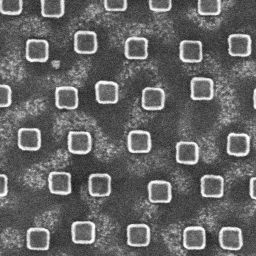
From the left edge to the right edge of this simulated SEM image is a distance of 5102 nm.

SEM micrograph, a regular array of raised bodies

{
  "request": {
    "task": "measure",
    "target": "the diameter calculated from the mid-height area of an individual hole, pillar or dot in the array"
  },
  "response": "0.457 micrometres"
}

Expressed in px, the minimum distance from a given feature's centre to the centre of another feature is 45.5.